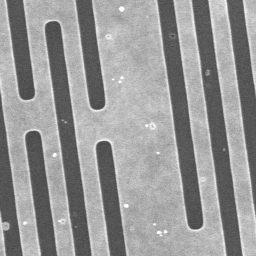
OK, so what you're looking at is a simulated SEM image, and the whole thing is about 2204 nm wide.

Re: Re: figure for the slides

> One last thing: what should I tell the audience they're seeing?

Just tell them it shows groups of lines, slits or small figures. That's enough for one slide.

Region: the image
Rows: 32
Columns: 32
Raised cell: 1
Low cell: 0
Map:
10011111100111111111001100110011
10011111110011111111001100110001
10011111110011111111001100111001
10011100110011111111001100111001
10011100110011111111001100011001
10001100110011111111001110011001
11001100110011111111000110011001
11001100110011111111100110011001
11001100110001111111100110011001
11001100111001111111100110011100
11001110011001111111100110011100
11001110011001111111100110001100
11111110011001111111100111001100
11111110011101111111100011001100
11111110011111111111110011001100
01111110011111111111110011001100
01110110011111111111110011001100
01100111001111111111110011001110
01100111001100111111110011000110
01100111001100111111110011100110
01110011001100111111110001100110
01110011001100111111111001100110
00110011001100011111111001100110
00110011001110011111111001100110
00110011001110011111111001100111
00110011000110011111111001100111
00110011100110011111111001100011
00110001100110011111111001110011
00111001100110011111111101110011
00111001100110011111111111110011
10011001100110001111111111110011
10011001100111001111111111110011